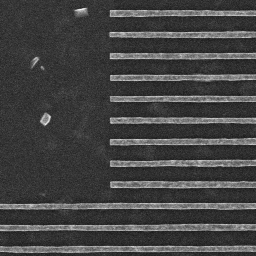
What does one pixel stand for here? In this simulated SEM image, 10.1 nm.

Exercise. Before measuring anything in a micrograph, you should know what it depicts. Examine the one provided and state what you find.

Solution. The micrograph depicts parallel lines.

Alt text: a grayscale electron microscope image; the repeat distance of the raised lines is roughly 217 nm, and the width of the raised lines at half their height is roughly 55.6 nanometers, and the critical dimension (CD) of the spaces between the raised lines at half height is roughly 158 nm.